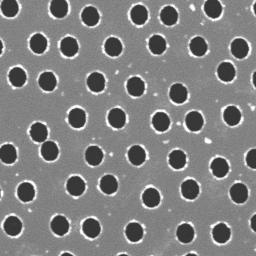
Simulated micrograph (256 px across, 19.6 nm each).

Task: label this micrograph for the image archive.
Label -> a regular array of holes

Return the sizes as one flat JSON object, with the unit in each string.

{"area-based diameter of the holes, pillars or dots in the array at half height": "384 nanometres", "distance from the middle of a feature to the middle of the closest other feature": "646 nm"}